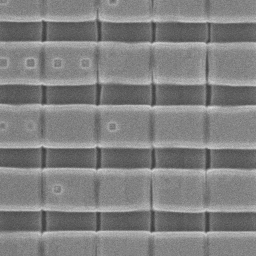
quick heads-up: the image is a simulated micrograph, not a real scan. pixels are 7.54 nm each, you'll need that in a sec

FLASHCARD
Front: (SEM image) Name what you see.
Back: wiring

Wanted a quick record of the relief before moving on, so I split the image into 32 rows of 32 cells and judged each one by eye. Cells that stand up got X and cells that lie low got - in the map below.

XXXXXXXXXXXXXXXXXXXXXXXXXXXXXXXX
XXXXXXXXXXXXXXXXXXXXXXXXXXXXXXXX
XXXXXXXXXXX--XXXXXXXXXXXXXXXXXXX
--------------------------------
--------------------------------
XXXXXXXXXXXXXXXXXXXXXXXXXXXXXXXX
XXXXXXXXXXXXXXXXXXXXXXXXXXXXXXXX
-XXXXXXXXXXXXXXXXXXXXXXXXXXXXXXX
XXXXXXXXXXXXXXXXXXXXXXXXXXXXXXXX
XXXXXXXXXXXXXXXXXXXXXXXXXXXXXXXX
XX-XXXXXXXX-----XX----XXX--XXXXX
--------------------------------
--------------------------------
XXXXXXXXXXXXXXXXXXXXXXXXXXXXXXXX
XXXXXXXXXXXXXXXXXXXXXXXXXXXXXXXX
XXXXXXXXXXXXXXXXXXXXXXXXXXXXXXXX
XXXXXXXXXXXXXXXXXXXXXXXXXXXXXXXX
XXXXXXXXXXXXXXXXXXXXXXXXXXXXXXXX
--------------------------XXXXXX
--------------------------------
--------------------------------
XXXXXXXXXXXXXXXXXXXXXXXXXXXXXXXX
XXXXXXXXXXXXXXXXXXXXXXXXXXXXXXXX
XXXXXXXXXXXXXXXXXXXXXXXXXXXXXXXX
XXXXXXXXXXXXXXXXXXXXXXXXXXXXXXXX
XXXXXXXXXXXXXXXXXXXXXXXXXXXXXXXX
-----------------------XX-------
--------------------------------
--------------------------------
XXXXXXXXXXXXXXXXXXXXXXXXXXXXXXXX
XXXXXXXXXXXXXXXXXXXXXXXXXXXXXXXX
XXXXXXXXXXXXXXXXXXXXXXXXXXXXXXXX